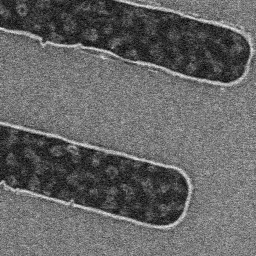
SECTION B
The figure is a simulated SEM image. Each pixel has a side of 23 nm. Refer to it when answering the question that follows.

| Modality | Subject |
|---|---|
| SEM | one or a few lines or trenches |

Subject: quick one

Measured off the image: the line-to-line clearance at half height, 2110 nm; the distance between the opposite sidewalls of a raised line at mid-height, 1380 nm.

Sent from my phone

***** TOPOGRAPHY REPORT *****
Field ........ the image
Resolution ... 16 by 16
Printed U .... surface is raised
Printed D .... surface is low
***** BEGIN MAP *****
UUUUUUUUUUDDDDDD
UUUUUUUUUUUUUUDD
DDUUUUUUUUUUUUUU
DDDDDDDUUUUUUUUU
DDDDDDDDDDDUUUUD
DDDDDDDDDDDDDDDD
DDDDDDDDDDDDDDDD
DDDDDDDDDDDDDDDD
UUUDDDDDDDDDDDDD
UUUUUUUDDDDDDDDD
UUUUUUUUUUUDDDDD
UUUUUUUUUUUUDDDD
DDDUUUUUUUUUDDDD
DDDDDDDUUUUDDDDD
DDDDDDDDDDDDDDDD
DDDDDDDDDDDDDDDD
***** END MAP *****